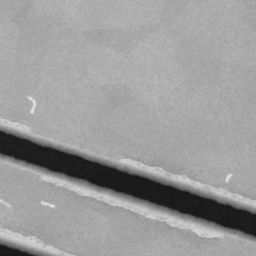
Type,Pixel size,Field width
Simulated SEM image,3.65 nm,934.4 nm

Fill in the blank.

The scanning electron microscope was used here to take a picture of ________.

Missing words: one or a few lines or trenches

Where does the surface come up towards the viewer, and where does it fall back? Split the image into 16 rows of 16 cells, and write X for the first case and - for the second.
XXXXXXXXXXXXXXXX
XXXXXXXXXXXXXXXX
XXXXXXXXXXXXXXXX
XXXXXXXXXXXXXXXX
XXXXXXXXXXXXXXXX
XXXXXXXXXXXXXXXX
XXXXXXXXXXXXXXXX
XXXXXXXXXXXXXXXX
--XXXXXXXXXXXXXX
-----XXXXXXXXXXX
XX------XXXXXXXX
XXXXX------XXXXX
XXXXXXXX------XX
XXXXXXXXXXX-----
XXXXXXXXXXXXXXX-
-XXXXXXXXXXXXXXX